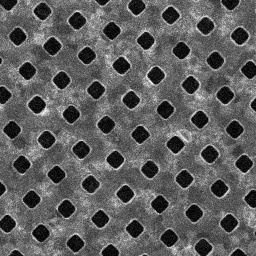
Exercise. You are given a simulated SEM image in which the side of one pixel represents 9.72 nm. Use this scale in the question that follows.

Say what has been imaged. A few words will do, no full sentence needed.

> a regular array of holes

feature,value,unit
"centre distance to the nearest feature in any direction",341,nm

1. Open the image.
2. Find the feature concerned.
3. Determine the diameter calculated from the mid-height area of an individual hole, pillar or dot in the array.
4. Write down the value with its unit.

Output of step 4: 0.165 um